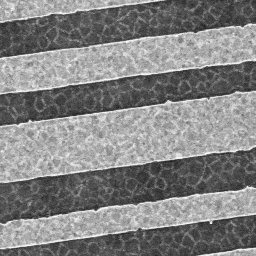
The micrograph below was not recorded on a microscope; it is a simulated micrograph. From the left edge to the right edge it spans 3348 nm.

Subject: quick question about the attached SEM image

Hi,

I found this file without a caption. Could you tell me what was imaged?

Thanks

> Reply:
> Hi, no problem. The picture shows one or a few lines or trenches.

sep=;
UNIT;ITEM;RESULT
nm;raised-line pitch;1030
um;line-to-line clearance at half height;0.475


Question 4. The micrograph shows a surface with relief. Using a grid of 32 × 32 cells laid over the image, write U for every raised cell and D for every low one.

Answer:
UUUUUUUUUUUUUUUUUDDDDDDDDDDDDDDD
UUUUUUUUUDDDDDDDDDDDDDDDDDDDDDDD
UUDDDDDDDDDDDDDDDDDDDDDDDDDDDDDD
DDDDDDDDDDDDDDDDDDDDDDDDDDDDUUUU
DDDDDDDDDDDDDDDDDDDDDUUUUUUUUUUU
DDDDDDDDDDDDDDUUUUUUUUUUUUUUUUUU
DDDDDUUUUUUUUUUUUUUUUUUUUUUUUUUU
UUUUUUUUUUUUUUUUUUUUUUUUUUUUUUUU
UUUUUUUUUUUUUUUUUUUUUUUUDDDDDDDD
UUUUUUUUUUUUUUUUDDDDDDDDDDDDDDDD
UUUUUUUUUUDDDDDDDDDDDDDDDDDDDDDD
UDDDDDDDDDDDDDDDDDDDDDDDDDDDDDDU
DDDDDDDDDDDDDDDDDDDDDDDDUUUUUUUU
DDDDDDDDDDDDDDDDDUUUUUUUUUUUUUUU
DDDDDDDDDDUUUUUUUUUUUUUUUUUUUUUU
DDDUUUUUUUUUUUUUUUUUUUUUUUUUUUUU
UUUUUUUUUUUUUUUUUUUUUUUUUUUUUUUU
UUUUUUUUUUUUUUUUUUUUUUUUUUUUUUUU
UUUUUUUUUUUUUUUUUUUUUUUUUUUUUUUD
UUUUUUUUUUUUUUUUUUUUUUUUDDDDDDDD
UUUUUUUUUUUUUUUUUUDDDDDDDDDDDDDD
UUUUUUUUUUDDDDDDDDDDDDDDDDDDDDDD
UUDDDDDDDDDDDDDDDDDDDDDDDDDDDDDD
DDDDDDDDDDDDDDDDDDDDDDDDDDDDDDDD
DDDDDDDDDDDDDDDDDDDDDDDDUUUUUUUU
DDDDDDDDDDDDDDDDDDUUUUUUUUUUUUUU
DDDDDDDDDDUUUUUUUUUUUUUUUUUUUUUU
DDUUUUUUUUUUUUUUUUUUUUUUUUUDDDDD
UUUUUUUUUUUUUUUUUUUDDDDDDDDDDDDD
UUUUUUUUUUUUDDDDDDDDDDDDDDDDDDDD
UUUUUDDDDDDDDDDDDDDDDDDDDDDDDDDD
DDDDDDDDDDDDDDDDDDDDDDDDDDDDDUUU